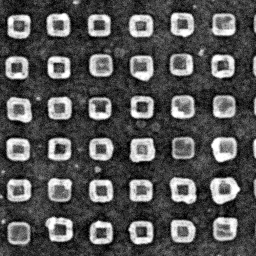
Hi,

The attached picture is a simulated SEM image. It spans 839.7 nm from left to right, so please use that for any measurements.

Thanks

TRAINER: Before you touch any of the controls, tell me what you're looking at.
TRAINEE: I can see a regular array of raised bodies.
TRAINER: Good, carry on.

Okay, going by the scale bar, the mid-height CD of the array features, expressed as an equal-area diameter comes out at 0.0765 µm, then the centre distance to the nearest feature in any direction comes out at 131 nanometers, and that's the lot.